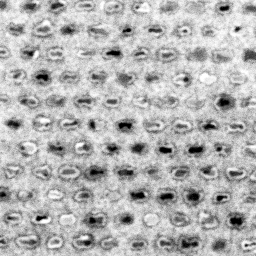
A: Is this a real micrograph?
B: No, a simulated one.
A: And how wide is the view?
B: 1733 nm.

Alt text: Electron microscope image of a regular array of raised bodies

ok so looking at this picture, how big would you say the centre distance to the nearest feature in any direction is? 179 nanometres